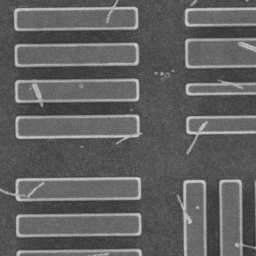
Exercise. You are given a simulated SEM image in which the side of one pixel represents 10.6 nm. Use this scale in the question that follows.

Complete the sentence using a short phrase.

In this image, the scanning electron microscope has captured groups of lines, slits or small figures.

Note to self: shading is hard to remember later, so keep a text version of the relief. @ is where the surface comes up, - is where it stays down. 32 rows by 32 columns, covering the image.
--------------------------------
--@@@@@@@@@@@@@@@------@@@@@@@@@
--@@@@@@@@@@@@@@@------@@@@@@@@@
--@@@@@@@@@@@@@@@---------------
--------------------------------
---------------@@------@@@@@@@@@
--@@@@@@@@@@@@@@@------@@@@@@@@@
--@@@@@@@@@@@@@@@------@@@@@@@@@
--------------------------------
--------------------------------
--@@@@@@@@@@@@@@@-----------@@@@
--@@@@@@@@@@@@@@@-------@@@@@@@@
--@@@@@@@@@@@@@-----------------
--------------------------------
--------------------------------
--@@@@@@@@@@@@@@@------@@@@@@@@@
--@@@@@@@@@@@@@@@-------@@@@@@@@
--------------------------------
--------------------------------
--------------------------------
--------------------------------
--------------------------------
--@@@@@@@@@@@@@@@---------------
--@@@@@@@@@@@@@@@------@@@--@@--
--@@@@@@@@@@@@@@@------@@@--@@--
-----------------------@@@--@@--
-----------------------@@@--@@--
--@@@@@@@@@@@@@@@------@@@--@@--
--@@@@@@@@@@@@@@@------@@@--@@--
-----------------------@@@--@@--
-----------------------@@@--@@--
---@@@@@@@@@@@@@@------@@@--@@--